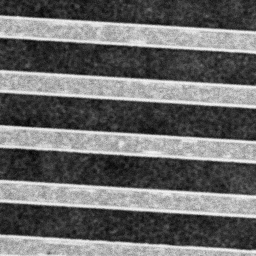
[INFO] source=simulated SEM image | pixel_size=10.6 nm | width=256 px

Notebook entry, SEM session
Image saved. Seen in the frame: parallel lines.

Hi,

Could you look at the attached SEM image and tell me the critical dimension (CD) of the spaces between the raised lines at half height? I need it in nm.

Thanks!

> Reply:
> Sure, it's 373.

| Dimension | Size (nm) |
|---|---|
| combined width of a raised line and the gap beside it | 576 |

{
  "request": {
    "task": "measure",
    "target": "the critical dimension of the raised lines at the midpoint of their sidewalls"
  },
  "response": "202 nanometres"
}